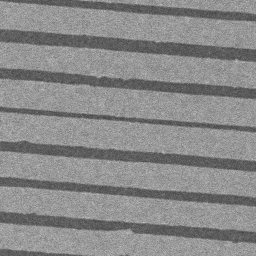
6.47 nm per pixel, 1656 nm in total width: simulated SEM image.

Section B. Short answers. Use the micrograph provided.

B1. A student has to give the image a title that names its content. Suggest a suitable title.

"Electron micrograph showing parallel lines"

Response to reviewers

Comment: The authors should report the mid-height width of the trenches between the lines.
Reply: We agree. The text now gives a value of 75 nm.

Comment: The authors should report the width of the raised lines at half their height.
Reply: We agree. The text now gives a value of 26.1 px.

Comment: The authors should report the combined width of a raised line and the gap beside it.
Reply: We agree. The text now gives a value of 237 nm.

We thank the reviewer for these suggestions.